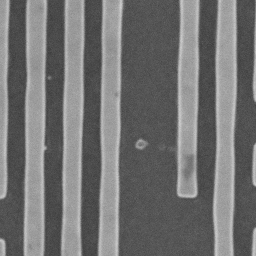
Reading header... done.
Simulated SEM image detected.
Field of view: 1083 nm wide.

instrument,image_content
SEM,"groups of lines, slits or small figures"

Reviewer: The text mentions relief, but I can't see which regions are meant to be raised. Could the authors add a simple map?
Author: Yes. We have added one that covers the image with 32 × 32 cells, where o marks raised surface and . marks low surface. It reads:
o..ooo..oo...oo........oo..oo...
o..ooo..oo...oo........oo..oo...
o..ooo..oo...oo........oo..oo...
o..ooo..oo...oo........oo..oo...
o..ooo..oo...oo........oo..oo...
o..ooo..oo...oo.......ooo..oo...
o..ooo..oo...oo.......ooo..oo...
o..ooo..oo...oo.......ooo..oo...
o..ooo..oo...oo.......ooo..oo...
o..ooo..oo...oo.......ooo..oo...
o..ooo..oo...oo.......ooo..oo...
o..ooo..oo...oo.......ooo..oo...
o..ooo..oo...oo.......ooo..oo...
o..ooo..oo...oo.......ooo..oo...
o..ooo..oo...oo.......ooo..oo...
o..ooo..oo...oo.......ooo..oo...
o..ooo..oo...oo.......ooo..oo...
o..ooo..oo...oo.......ooo..oo...
o..oo...oo...oo.......ooo..oo...
o..oo...oo...oo.......oo...oo...
o..oo...oo...oo.......oo...oo...
o..oo...oo...oo.......oo...oo...
o..oo...oo...oo.......ooo..oo...
o..oo...oo...oo.......ooo..oo...
o..oo...oo...oo........o...oo...
...oo...oo...oo............oo...
...oo...oo...oo............oo...
...oo...oo..ooo............oo...
...oo...oo..ooo............oo...
...oo...oo..ooo............oo...
o..oo...oo..ooo............oo...
o..oo...oo..ooo............oo...